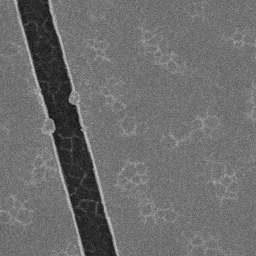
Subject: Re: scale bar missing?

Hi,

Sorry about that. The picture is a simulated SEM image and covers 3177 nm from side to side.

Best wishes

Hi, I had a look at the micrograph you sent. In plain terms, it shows one or a few lines or trenches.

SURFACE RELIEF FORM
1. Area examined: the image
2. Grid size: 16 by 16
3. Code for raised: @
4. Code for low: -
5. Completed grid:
@--@@@@@@@@@@@@@
@--@@@@@@@@@@@@@
@@--@@@@@@@@@@@@
@@--@@@@@@@@@@@@
@@--@@@@@@@@@@@@
@@---@@@@@@@@@@@
@@@--@@@@@@@@@@@
@@@--@@@@@@@@@@@
@@@--@@@@@@@@@@@
@@@---@@@@@@@@@@
@@@@--@@@@@@@@@@
@@@@--@@@@@@@@@@
@@@@--@@@@@@@@@@
@@@@@--@@@@@@@@@
@@@@@--@@@@@@@@@
@@@@@--@@@@@@@@@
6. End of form